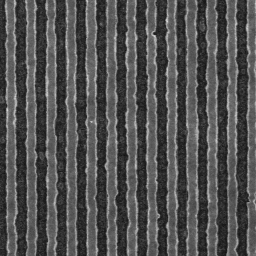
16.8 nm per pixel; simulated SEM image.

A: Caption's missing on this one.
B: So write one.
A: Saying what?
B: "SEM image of parallel lines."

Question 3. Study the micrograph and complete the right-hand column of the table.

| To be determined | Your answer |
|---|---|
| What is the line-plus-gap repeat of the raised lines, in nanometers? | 338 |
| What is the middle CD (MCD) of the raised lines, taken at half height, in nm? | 149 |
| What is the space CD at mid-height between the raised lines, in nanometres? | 191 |